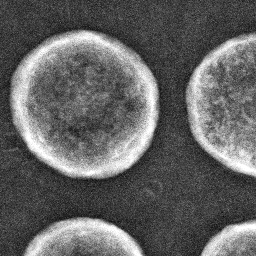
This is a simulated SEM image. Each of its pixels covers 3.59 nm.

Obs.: raised bodies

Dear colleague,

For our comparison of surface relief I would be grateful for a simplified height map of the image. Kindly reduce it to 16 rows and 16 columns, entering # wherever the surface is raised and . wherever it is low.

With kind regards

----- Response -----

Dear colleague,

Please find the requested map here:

................
................
....##.........#
..######.....###
.########...#.##
.#########..####
.#########..####
.#########..####
..#######....###
..#######....###
....###........#
................
................
................
...####.......##
..######.....###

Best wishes